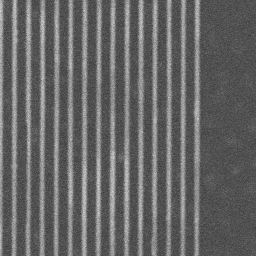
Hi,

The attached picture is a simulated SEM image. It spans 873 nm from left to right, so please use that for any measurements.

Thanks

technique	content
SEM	parallel lines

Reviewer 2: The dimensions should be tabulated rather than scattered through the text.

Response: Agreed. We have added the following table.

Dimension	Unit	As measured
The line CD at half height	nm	9.4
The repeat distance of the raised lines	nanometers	47.9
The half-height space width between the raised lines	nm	37.5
